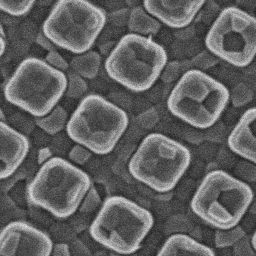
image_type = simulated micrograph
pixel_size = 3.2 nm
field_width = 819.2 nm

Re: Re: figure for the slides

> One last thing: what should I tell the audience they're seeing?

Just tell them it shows a regular array of raised bodies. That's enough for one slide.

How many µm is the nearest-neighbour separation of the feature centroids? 0.232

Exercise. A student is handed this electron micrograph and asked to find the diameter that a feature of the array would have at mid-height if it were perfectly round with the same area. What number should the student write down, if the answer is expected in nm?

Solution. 172